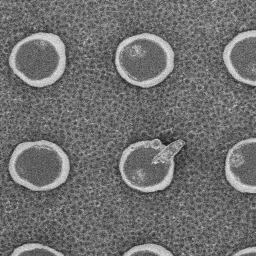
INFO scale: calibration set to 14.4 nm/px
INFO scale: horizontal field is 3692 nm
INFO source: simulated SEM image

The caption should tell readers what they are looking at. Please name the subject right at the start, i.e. raised bodies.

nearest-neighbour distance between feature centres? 1510 nanometers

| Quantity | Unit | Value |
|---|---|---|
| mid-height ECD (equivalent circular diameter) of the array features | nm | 733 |